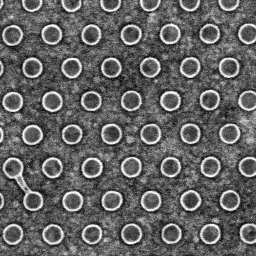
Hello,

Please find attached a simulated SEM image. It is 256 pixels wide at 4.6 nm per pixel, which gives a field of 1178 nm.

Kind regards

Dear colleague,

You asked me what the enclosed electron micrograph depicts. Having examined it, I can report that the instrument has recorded a regular array of raised bodies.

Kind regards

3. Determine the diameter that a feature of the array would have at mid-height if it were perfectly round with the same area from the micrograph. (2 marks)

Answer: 88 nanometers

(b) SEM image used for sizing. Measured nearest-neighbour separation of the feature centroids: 0.176 um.